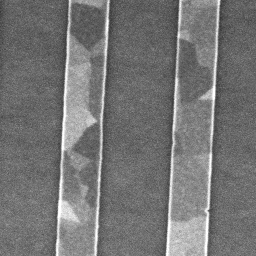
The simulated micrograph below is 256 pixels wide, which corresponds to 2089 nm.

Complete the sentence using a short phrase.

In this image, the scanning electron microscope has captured one or a few lines or trenches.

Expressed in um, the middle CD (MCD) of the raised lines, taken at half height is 0.319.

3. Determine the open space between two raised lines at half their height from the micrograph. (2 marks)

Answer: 581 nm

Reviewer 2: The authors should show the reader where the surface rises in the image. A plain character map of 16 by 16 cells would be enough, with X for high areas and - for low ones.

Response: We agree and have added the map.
----XXX----XXX--
----XXX----XXX--
----XXX----XXX--
----XXX----XXX--
----XXX----XX---
----XXX----XX---
----XX-----XX---
----XX-----XX---
----XX-----XX---
----XX-----XX---
----XX-----XX---
----XX-----XX---
----XX-----XX---
----XX-----XX---
----XX-----XX---
----XX----XXX---